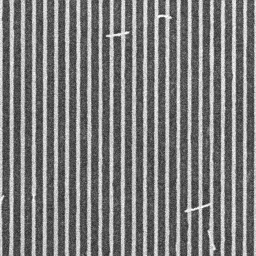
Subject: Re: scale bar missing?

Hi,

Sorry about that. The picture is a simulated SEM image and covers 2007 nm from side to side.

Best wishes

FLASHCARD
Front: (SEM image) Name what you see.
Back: parallel lines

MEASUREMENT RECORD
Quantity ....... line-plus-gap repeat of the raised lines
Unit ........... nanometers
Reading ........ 87.1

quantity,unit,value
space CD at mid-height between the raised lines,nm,61.7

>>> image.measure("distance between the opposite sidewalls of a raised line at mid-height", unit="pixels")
2.74